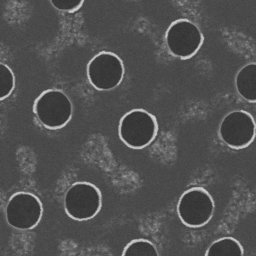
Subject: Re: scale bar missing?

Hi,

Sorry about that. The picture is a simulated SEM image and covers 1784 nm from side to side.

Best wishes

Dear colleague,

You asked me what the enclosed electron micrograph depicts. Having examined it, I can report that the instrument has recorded a regular array of holes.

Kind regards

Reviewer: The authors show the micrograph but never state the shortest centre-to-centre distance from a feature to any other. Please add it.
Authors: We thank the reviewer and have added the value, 0.451 micrometres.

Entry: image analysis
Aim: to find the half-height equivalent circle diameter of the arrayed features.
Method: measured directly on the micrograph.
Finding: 236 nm